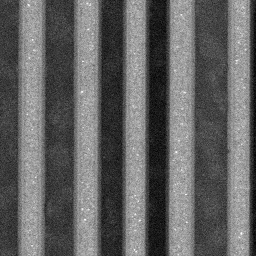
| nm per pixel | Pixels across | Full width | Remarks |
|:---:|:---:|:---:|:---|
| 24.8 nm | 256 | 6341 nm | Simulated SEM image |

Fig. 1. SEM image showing parallel lines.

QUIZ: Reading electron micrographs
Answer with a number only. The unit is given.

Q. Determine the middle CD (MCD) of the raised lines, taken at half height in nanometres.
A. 539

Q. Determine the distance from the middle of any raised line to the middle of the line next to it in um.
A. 1.29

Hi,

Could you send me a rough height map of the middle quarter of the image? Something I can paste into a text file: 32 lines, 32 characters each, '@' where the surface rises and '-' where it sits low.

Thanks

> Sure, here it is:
---@@@@@@------@@@@@@-----@@@@@@
---@@@@@@------@@@@@@-----@@@@@@
---@@@@@@------@@@@@@-----@@@@@@
---@@@@@@------@@@@@@-----@@@@@@
---@@@@@@------@@@@@@-----@@@@@@
---@@@@@@------@@@@@@-----@@@@@@
---@@@@@@-------@@@@@-----@@@@@@
---@@@@@@-------@@@@@-----@@@@@@
---@@@@@@------@@@@@@-----@@@@@@
---@@@@@@------@@@@@@-----@@@@@@
---@@@@@@------@@@@@@-----@@@@@@
---@@@@@@------@@@@@@-----@@@@@@
---@@@@@@------@@@@@@-----@@@@@@
---@@@@@@------@@@@@@-----@@@@@@
---@@@@@@------@@@@@@-----@@@@@@
---@@@@@@------@@@@@@-----@@@@@@
---@@@@@@------@@@@@@-----@@@@@@
---@@@@@@------@@@@@@-----@@@@@@
---@@@@@@------@@@@@@-----@@@@@@
---@@@@@@------@@@@@@-----@@@@@@
---@@@@@@------@@@@@@-----@@@@@@
---@@@@@@------@@@@@@-----@@@@@@
---@@@@@@------@@@@@@-----@@@@@@
---@@@@@@------@@@@@------@@@@@@
---@@@@@@------@@@@@------@@@@@@
---@@@@@@------@@@@@------@@@@@@
---@@@@@@------@@@@@------@@@@@@
---@@@@@@------@@@@@------@@@@@@
---@@@@@@------@@@@@------@@@@@@
---@@@@@@------@@@@@------@@@@@@
---@@@@@@------@@@@@------@@@@@@
---@@@@@@------@@@@@------@@@@@@